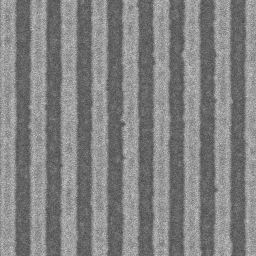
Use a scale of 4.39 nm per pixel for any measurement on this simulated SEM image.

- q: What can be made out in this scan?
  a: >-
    parallel lines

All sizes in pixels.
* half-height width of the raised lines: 13.4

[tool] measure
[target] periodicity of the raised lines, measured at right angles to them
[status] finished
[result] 135 nanometers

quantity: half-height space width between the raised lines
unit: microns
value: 0.0795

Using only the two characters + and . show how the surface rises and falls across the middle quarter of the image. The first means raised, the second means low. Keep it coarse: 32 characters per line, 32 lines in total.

+++....++++....+++.....+++....++
+++....++++....+++.....+++.....+
+++....+++.....+++.....+++....++
+++....++++....+++.....+++....++
+++....+++.....+++.....+++....++
+++....+++.....+++.....+++.....+
+++....+++.....+++.....+++.....+
+++....++++....+++.....+++....++
+++....+++.....+++.....+++....++
+++....+++.....+++.....+++....++
+++....+++.....+++.....+++....++
+++....+++.....+++.....+++....++
+++....++++....+++.....+++....++
+++....++++....+++.....+++....++
+++....++++....+++.....+++....++
+++....++++....+++.....+++.....+
+++....++++....+++.....+++....++
+++....+++.....+++.....+++....++
+++....++++....+++.....+++....++
+++....++++....+++.....+++....++
+++....+++.....+++.....+++....++
+++....++++....+++.....+++.....+
+++....++++....+++.....+++....++
+++....++++.....++.....+++....++
+++....+++.....+++.....+++....++
+++....+++.....+++.....+++....++
+++....+++.....+++.....+++....++
+++....+++.....+++.....+++....++
+++....++++....+++.....+++....++
+++....+++.....+++.....+++....++
+++....+++.....+++.....+++....++
+++....+++.....+++.....+++....++